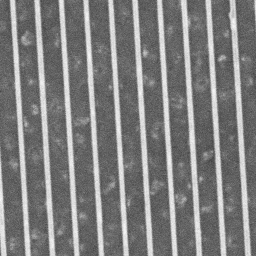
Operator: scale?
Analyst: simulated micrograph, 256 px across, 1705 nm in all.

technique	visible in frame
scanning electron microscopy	parallel lines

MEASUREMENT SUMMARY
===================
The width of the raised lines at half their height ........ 28.2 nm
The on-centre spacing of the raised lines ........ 0.162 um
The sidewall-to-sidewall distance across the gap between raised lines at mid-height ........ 0.131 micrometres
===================